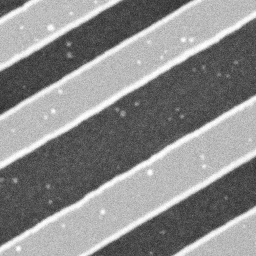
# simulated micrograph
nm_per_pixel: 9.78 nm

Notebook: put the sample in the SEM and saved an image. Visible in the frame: lines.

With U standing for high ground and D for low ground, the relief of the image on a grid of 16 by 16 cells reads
DUUUUUUDDDDUUUUU
UUUUUDDDDDUUUUUD
UUUDDDDDUUUUUUDD
UUDDDDUUUUUUDDDD
DDDDDUUUUUDDDDDD
DDDUUUUUUDDDDDDD
DUUUUUUDDDDDDDDU
UUUUUDDDDDDDDUUU
UUUUDDDDDDDDUUUU
UUDDDDDDDDUUUUUU
DDDDDDDDUUUUUUUD
DDDDDDDUUUUUUDDD
DDDDDUUUUUUDDDDD
DDDUUUUUUUDDDDDU
DDUUUUUUDDDDDUUU
UUUUUUDDDDDDUUUU